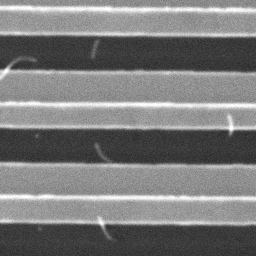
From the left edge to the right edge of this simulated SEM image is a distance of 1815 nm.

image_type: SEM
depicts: lines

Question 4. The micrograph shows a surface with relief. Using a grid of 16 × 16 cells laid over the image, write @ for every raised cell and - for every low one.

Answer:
@@@@@@@@@@@@@@@@
@@@@@@@@@@@@@@@@
----------------
----------------
@@@@@-@@--------
@@@@@@@@@@@@@@@@
@@@@@@@@@@@@@@@@
@@@@@@@@@@@@@@@@
----------------
----------------
@@@@@@@@@@@@@@@@
@@@@@@@@@@@@@@@@
@@@@@@@@@@@@@@@@
@@@@@@@@@@@@@@@@
----------------
----------------